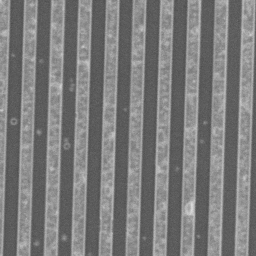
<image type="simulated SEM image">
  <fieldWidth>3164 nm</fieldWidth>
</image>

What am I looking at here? parallel lines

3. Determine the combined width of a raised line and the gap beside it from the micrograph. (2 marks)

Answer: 337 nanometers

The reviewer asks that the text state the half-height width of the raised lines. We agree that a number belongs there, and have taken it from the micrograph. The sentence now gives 159 nm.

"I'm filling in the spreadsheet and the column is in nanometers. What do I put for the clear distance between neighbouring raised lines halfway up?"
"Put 182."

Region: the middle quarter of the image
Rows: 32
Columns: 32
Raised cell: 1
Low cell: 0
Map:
00011100001110000111000011100001
00011100001110000111000011100001
00011100001110000111000011100001
00011100001110000111000011100001
00011100001110000111000011100001
00011100001110000111000011000001
00011100001110000111000011000001
00011100001110000111000011000001
00011100001110000111000011000001
00011100001110000111000011000001
00011100001110000111000011000011
00011100001110000111000011000011
00011100001110000111000011000011
00011100001110000111000011000011
00011100001110000111000111000011
00011100001110000111000111000011
00011100001110000111000111000011
00011100001110000110000111000011
00011100001110001110000111000011
00011100001110001110000111000011
00011100001110001110000111000011
00011100001100001110000111000011
00011100001100001110000111000011
00011100001100001110000111000011
00011100001100001110000111000011
00011100001100001110000111000011
00011100001100001110000111000011
00011100001100001110000111000011
00011100001100001110000111000011
00011000001100001110000111000011
00011000011100001110000111000011
00011100011100001110000111000011